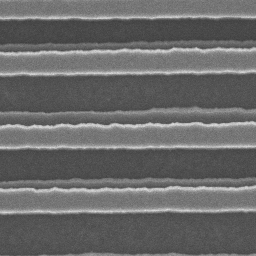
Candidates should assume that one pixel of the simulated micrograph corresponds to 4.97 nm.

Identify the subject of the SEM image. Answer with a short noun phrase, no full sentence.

lines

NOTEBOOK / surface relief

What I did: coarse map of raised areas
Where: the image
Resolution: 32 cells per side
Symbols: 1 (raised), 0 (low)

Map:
11111111111111111111111111111111
11111111111111111111111111111111
00000000000000000000000000000000
00000000000000000000000000000000
00000000000000000000000000000000
00000000000000000000000000000000
00000111111111111111111111111111
11111111111111111111111111111111
11111111111111111111111111111111
00000000000000000000000000000000
00000000000000000000000000000000
00000000000000000000000000000000
00000000000000000000000000000000
00000000000000000000000000000000
00000000000000000000000000000000
00000001001100100011111111111111
11111111111111111111111111111111
11111111111111111111111111111111
11101111111111111110000000000000
00000000000000000000000000000000
00000000000000000000000000000000
00000000000000000000000000000000
00000000000000000000000000000000
00000000000001000000011111111111
11111111111111111111111111111111
11111111111111111111111111111111
11100011000000000000000000000000
00000000000000000000000000000000
00000000000000000000000000000000
00000000000000000000000000000000
00000000000000000000000000000000
00000000000000000000000000000000